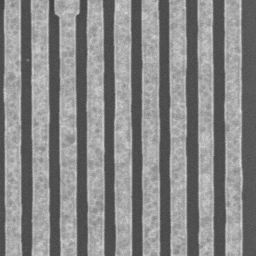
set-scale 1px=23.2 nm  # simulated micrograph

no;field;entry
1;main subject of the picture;wiring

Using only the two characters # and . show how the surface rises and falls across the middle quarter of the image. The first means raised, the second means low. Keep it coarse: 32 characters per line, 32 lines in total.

###...####...###....####...###..
###...####...###....####...###..
###...####...###....####...###..
###...####...###....####...###..
###...####...###....####...###..
###...####...###....####...###..
###...####...####...####...###..
###...####...####...###....###..
###...####...####...###....###..
###...####...####...###....###..
###...####...###....####...###..
###...####...###....####...###..
###...####...####...####...###..
###...####...####...####...###..
###...####...####...####...###..
###...####...####...####...###..
###...####...####...####...###..
###...####...####...####...###..
###...####...####...####...###..
###...####...####...####...###..
###...####...####...####...###..
###...####...####...####...###..
###...####...####...####...###..
###...####...####...####...###..
###...####...####...####...###..
###...####...####...####...###..
###...####...####...####...###..
###...####...####...####...###..
###...####...####...####...###..
###...####...####...####...###..
###...####...####...####...###..
###...####...####...####...###..